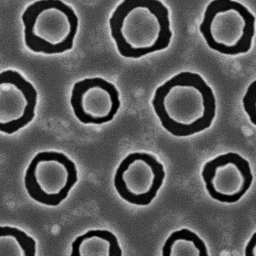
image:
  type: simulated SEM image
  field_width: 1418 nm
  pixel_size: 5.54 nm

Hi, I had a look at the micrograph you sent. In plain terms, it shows ring-shaped grooves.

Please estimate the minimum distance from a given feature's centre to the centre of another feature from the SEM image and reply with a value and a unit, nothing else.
485 nanometres